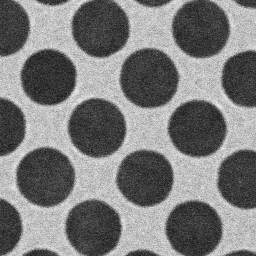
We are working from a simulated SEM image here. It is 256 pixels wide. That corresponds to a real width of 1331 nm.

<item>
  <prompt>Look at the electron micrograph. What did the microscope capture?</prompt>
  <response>holes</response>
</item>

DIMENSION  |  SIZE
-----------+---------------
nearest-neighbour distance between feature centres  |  363 nanometers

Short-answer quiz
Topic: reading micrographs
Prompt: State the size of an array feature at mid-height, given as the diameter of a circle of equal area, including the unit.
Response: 309 nanometers